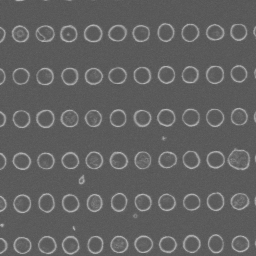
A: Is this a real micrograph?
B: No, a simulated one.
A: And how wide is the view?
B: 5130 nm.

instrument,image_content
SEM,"a regular array of raised bodies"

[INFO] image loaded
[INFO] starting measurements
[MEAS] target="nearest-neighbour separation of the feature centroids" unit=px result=23.8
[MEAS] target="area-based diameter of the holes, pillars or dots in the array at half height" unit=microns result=0.337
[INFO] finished